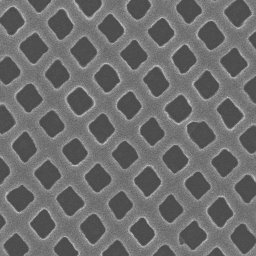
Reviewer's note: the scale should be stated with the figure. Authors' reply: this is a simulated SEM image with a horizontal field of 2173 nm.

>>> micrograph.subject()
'a regular array of holes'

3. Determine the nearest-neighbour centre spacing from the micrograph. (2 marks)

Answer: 296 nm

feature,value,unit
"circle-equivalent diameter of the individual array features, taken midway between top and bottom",0.206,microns